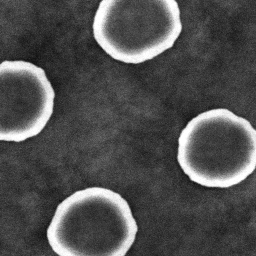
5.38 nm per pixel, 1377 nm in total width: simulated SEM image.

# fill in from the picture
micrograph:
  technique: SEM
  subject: raised bodies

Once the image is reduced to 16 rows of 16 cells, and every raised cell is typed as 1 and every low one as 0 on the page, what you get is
0000001111100000
0000001111100000
0000001111100000
0000000110000000
1100000000000000
1110000000000000
1110000000000000
1110000000001110
1100000000011111
0000000000011111
0000000000001111
0000000000000100
0000111000000000
0000111100000000
0001111100000000
0000111100000000